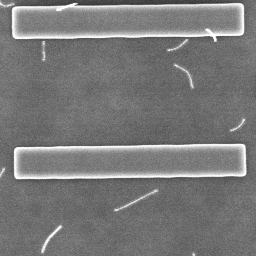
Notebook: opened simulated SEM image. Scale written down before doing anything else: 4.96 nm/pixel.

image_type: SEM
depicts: groups of lines, slits or small figures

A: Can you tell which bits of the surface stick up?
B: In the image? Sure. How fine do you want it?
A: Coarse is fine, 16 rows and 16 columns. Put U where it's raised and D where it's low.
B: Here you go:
DUUUUUUUUUUUUUUD
DUUUUUUUUUUUUUUD
DDDDDDDDDDDDDDDD
DDDDDDDDDDDDDDDD
DDDDDDDDDDDDDDDD
DDDDDDDDDDDDDDDD
DDDDDDDDDDDDDDDD
DDDDDDDDDDDDDDDD
DDDDDDDDDDDDDDDD
DUUUUUUUUUUUUUUD
DUUUUUUUUUUUUUUD
DDDDDDDDDDDDDDDD
DDDDDDDDDDDDDDDD
DDDDDDDDDDDDDDDD
DDDDDDDDDDDDDDDD
DDDDDDDDDDDDDDDD